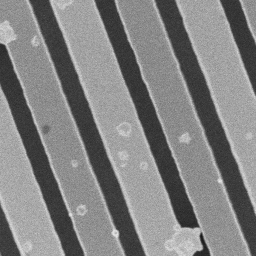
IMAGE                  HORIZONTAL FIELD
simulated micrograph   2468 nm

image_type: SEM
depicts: lines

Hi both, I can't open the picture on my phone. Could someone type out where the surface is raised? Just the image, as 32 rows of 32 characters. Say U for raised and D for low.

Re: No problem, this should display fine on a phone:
UUUUDDUUUUUUDDUUUUUDDDUUUUUUDDUU
UUUUDDDUUUUUDDDUUUUUDDUUUUUUDDUU
UUUUUDDUUUUUUDDUUUUUDDDUUUUUDDDU
UUUUUDDUUUUUUDDUUUUUUDDUUUUUUDDU
UUUUUDDDUUUUUDDDUUUUUDDDUUUUUDDD
UUUUUUDDUUUUUUDDUUUUUDDDUUUUUDDD
DUUUUUDDDUUUUUDDDUUUUUDDUUUUUUDD
DUUUUUDDDUUUUUUDDUUUUUDDDUUUUUDD
DDUUUUUDDUUUUUUDDUUUUUDDDUUUUUUD
DDUUUUUDDDUUUUUDDDUUUUUDDDUUUUUD
DDDUUUUUDDUUUUUUDDUUUUUDDDUUUUUD
DDDUUUUUDDUUUUUUDDDUUUUUDDUUUUUU
UDDUUUUUDDDUUUUUUDDUUUUUDDDUUUUU
UDDDUUUUUDDUUUUUUDDUUUUUDDDUUUUU
UUDDUUUUUDDDUUUUUDDDUUUUUDDUUUUU
UUDDUUUUUUDDUUUUUUDDUUUUUDDDUUUU
UUDDDUUUUUDDUUUUUUDDUUUUUUDDUUUU
UUUDDUUUUUDDDUUUUUDDDUUUUUDDDUUU
UUUDDUUUUUUDDUUUUUUDDUUUUUDDDUUU
UUUDDDUUUUUDDUUUUUUDDDUUUUUDDUUU
UUUUDDUUUUUDDDUUUUUUDDUUUUUDDDUU
UUUUDDDUUUUUDDUUUUUUDDUUUUUDDDUU
UUUUUDDUUUUUDDDUUUUUDDDUUUUUDDUU
UUUUUDDUUUUUUDDUUUUUUDDUUUUUDDDU
UUUUUDDDUUUUUDDUUUUUUDDUUUUUUDDU
UUUUUUDDUUUUUDDDUUUUUDDDUUUUUDDD
DUUUUUDDDUUUUUDDUUUUUUDDUUUUUDDD
DUUUUUDDDUUUUUDDDUUUUUDDDUUUUUDD
DUUUUUUDDUUUUUDDDUUUUUUDUUUUUUDD
DDUUUUUDDDUUUUUDDUUUUUUUUUUUUUDD
DDUUUUUUDDUUUUUDDDUUUUUUUDUUUUUD
DDUUUUUUDDUUUUUUDDUUUUUUUDUUUUUD